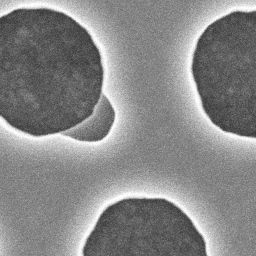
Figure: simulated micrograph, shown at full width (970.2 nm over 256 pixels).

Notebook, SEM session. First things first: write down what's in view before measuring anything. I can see holes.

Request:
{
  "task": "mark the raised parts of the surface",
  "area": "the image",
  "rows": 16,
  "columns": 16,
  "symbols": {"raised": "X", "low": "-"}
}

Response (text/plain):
X--XXXXXXXXXXXXX
-----XXXXXXXX---
------XXXXXX----
------XXXXXX----
-------XXXXX----
------XXXXXX----
-------XXXXXX---
-------XXXXXX---
XX-X---XXXXXXXX-
XXXXXXXXXXXXXXXX
XXXXXXXXXXXXXXXX
XXXXXXXXXXXXXXXX
XXXXXXX----XXXXX
XXXXXX------XXXX
XXXXXX------XXXX
XXXXX--------XXX